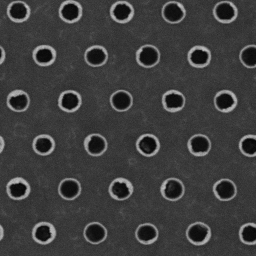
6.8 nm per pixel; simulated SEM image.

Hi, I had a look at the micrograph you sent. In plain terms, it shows a regular array of raised bodies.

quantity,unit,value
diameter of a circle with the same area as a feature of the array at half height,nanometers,149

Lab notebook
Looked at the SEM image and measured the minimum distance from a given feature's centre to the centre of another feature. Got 347 nanometers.